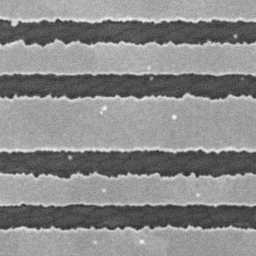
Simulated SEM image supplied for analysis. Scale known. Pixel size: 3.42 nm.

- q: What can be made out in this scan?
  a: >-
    lines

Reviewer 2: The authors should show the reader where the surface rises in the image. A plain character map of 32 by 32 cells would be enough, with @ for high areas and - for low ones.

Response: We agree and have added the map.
@@@@@@@@@@@@@@@@@@@@@@@@@@@@@@@@
@@@@@@@@@@@@@@@@@@@@@@@@@@@@@@@@
-@@@@@@--@@@@-@@@@@@@@-@@@@-@@@@
--------------------------------
--------------------------------
-@@---@@@@--@@@@@-@@-@----@@@-@@
@@@@@@@@@@@@@@@@@@@@@@@@@@@@@@@@
@@@@@@@@@@@@@@@@@@@@@@@@@@@@@@@@
@@@@@@@@@@@@@@@@@@@@@@@@@@@@@@@@
--------------------------------
--------------------------------
--------------------------------
@@@@@@@@@@@@@@@@@@@@@@@@@@@@@@@@
@@@@@@@@@@@@@@@@@@@@@@@@@@@@@@@@
@@@@@@@@@@@@@@@@@@@@@@@@@@@@@@@@
@@@@@@@@@@@@@@@@@@@@@@@@@@@@@@@@
@@@@@@@@@@@@@@@@@@@@@@@@@@@@@@@@
@@@@@@@@@@@@@@@@@@@@@@@@@@@@@@@@
@@@@@@@@@@@@@@@@@@@@@@@@@@@@@@@@
--------------------------------
--------------------------------
--------------------------------
@@@@@@@@@@@@@@@@@@@@@@@@@@@@@@@@
@@@@@@@@@@@@@@@@@@@@@@@@@@@@@@@@
@@@@@@@@@@@@@@@@@@@@@@@@@@@@@@@@
@@@@@@@@@@@@@@@@@@@@@@@@@@@@@@@@
--------------------------------
--------------------------------
--@---------------@-@@-@@---@---
@@@@@@@@@@@@@@@@@@@@@@@@@@@@@@@@
@@@@@@@@@@@@@@@@@@@@@@@@@@@@@@@@
@@@@@@@@@@@@@@@@@@@@@@@@@@@@@@@@